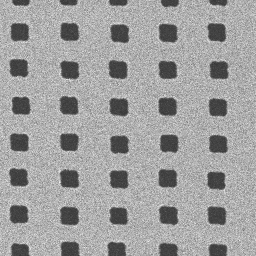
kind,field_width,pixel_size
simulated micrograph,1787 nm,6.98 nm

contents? a regular array of holes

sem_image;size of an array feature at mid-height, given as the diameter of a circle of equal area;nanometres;139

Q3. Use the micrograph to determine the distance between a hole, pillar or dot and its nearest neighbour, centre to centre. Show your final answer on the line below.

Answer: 255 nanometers